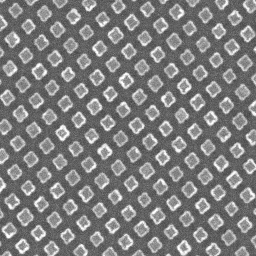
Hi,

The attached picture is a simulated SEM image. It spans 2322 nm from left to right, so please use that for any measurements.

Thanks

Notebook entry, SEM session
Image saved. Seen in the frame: a regular array of raised bodies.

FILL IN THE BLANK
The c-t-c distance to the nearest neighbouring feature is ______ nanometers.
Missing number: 186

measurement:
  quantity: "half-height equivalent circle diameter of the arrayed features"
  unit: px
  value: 13.1